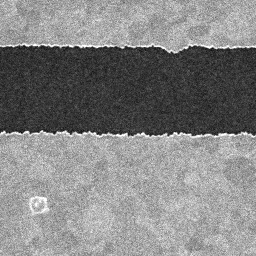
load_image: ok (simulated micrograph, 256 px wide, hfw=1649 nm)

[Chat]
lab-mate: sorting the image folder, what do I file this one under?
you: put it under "one or a few lines or trenches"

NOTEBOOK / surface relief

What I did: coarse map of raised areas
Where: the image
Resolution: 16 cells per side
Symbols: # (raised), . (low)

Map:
################
################
################
................
................
................
................
................
#########.######
################
################
################
################
################
################
################